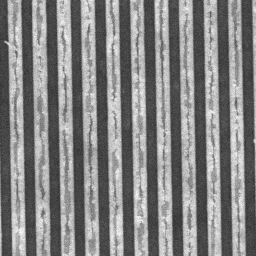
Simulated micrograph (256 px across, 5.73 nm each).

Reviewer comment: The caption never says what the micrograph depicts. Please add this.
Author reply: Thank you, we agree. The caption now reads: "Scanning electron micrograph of parallel lines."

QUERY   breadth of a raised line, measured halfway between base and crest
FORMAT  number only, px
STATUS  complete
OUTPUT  10.2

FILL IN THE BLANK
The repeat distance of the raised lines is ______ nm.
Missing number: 140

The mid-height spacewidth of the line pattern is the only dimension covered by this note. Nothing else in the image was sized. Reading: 0.0802 microns